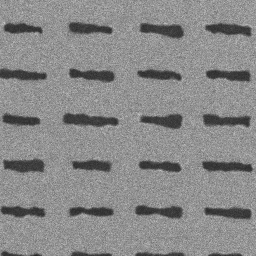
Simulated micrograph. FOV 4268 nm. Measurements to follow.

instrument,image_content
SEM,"a regular array of holes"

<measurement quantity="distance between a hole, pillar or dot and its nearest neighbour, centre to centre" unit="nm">760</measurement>